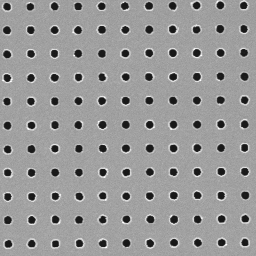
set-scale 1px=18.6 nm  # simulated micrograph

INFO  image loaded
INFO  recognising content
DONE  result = a regular array of holes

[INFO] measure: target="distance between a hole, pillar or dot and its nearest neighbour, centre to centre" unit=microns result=0.434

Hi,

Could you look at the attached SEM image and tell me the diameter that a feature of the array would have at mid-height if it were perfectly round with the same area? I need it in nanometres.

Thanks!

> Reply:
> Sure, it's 147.